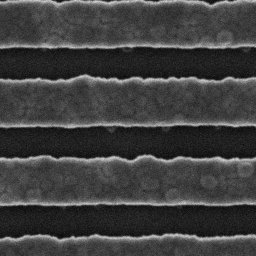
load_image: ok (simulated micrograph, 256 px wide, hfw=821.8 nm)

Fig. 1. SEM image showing lines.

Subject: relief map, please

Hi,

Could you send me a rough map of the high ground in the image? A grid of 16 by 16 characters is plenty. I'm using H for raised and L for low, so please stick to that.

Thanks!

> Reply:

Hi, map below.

HHHHHHHHHHHHHHHH
HHHHHHHHHHHHHHHH
HHHHHHHHHHHHHHHH
LLLLLLLLLLLLLLLL
LLLLLLLLLLLLLLLL
HHHHHHHHHHHHHHHH
HHHHHHHHHHHHHHHH
HHHHHHHHHHHHHHHH
LLLLLLLLLLLLLLLL
LLLLLLLLLLLLLLLL
HHHHHHHHHHHHHHHH
HHHHHHHHHHHHHHHH
HHHHHHHHHHHHHHHH
LLLLLLLLLLLLLLLL
LLLLLLLLLLLLLLLL
HHHHHHHHHHHHHHHH